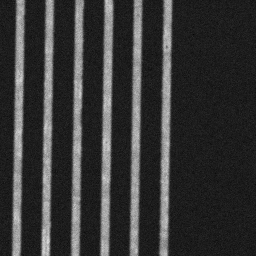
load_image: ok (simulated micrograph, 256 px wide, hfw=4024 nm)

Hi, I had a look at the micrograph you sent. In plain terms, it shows parallel lines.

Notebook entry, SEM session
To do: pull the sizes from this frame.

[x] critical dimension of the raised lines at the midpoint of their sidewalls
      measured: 114 nanometers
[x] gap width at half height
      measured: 354 nm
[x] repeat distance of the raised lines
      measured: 463 nanometres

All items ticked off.